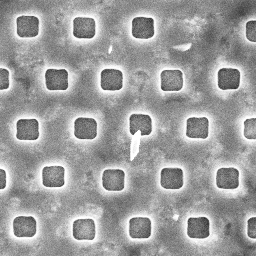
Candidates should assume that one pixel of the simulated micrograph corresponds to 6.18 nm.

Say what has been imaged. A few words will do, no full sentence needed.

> a regular array of holes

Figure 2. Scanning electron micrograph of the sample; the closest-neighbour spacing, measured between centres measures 0.34 um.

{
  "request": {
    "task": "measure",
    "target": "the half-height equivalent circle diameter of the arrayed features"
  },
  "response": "150 nm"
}